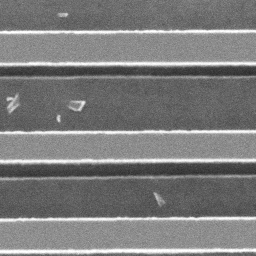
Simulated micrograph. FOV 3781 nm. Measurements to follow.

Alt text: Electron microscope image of lines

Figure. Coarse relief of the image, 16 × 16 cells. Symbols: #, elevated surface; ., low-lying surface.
................
................
################
################
................
................
................
................
################
################
................
................
................
................
################
################